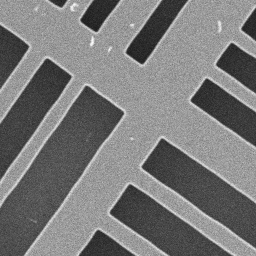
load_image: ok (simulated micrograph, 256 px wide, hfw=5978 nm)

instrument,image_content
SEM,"groups of lines, slits or small figures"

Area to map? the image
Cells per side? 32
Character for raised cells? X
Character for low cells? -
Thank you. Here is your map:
XXXXXXX-XXX----XXXXX---XXXXXXXXX
XXXXXXXXXXX---XXXXX---XXXXXXXXXX
XXXXXXXXXX---XXXXX----XXXXXXXXX-
-XXXXXXXXXX--XXXXX---XXXXXXXXX--
--XXXXXXXXXXXXXXX---XXXXXXXXXXX-
---XXXXXXXXXXXXX----XXXXXXXXXXXX
---XXXXXXXXXXXXX---XXXXXXXXX---X
---XXXXXXXXXXXXXX-XXXXXXXXX-----
--XXX---XXXXXXXXXXXXXXXXXXX-----
-XXX-----XXXXXXXXXXXXXXXXXXXX---
-XX-----XXXXXXXXXXXXXXXXX--XXX--
XXX-----XX--XXXXXXXXXXXXX---XXXX
XX-----XX-----XXXXXXXXXX------XX
X-----XXX------XXXXXXXXXX------X
X-----XX-------XXXXXXXXXXX------
-----XX--------XXXXXXXXXXXXX----
----XXX-------XXXXXXXXXXXXXXX---
----XX-------XXXXXXX-XXXXXXXXXX-
---XX-------XXXXXXX---XXXXXXXXXX
--XXX-------XXXXXXX-----XXXXXXXX
-XXX-------XXXXXXX-------XXXXXXX
-XX-------XXXXXXXX---------XXXXX
XX--------XXXXXXXXXX--------XXXX
XX-------XXXXXXX-XXXX--------XXX
X-------XXXXXXX----XXXX--------X
--------XXXXXX------XXXX--------
-------XXXXXXX-------XXXX-------
------XXXXXXXXX--------XXXX-----
------XXXXXXXXXX--------XXXX----
-----XXXXXXX--XXXX--------XXXX--
----XXXXXXX----XXXX--------XXXX-
---XXXXXXX------XXXX--------XXXX